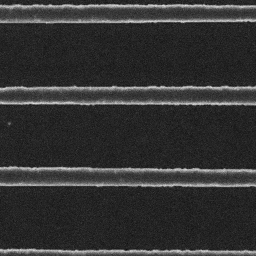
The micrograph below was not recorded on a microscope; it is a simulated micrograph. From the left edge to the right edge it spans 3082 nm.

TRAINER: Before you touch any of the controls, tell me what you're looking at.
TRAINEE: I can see lines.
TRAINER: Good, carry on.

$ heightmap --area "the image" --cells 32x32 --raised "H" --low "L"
LLLLLLLLLLLLLLLLLLLLLLLLLLLLLLLL
HHHHHHHHHHHHHHHHHHHHHHHHHHHHHHHH
HHHHHHHHHHHHHHHHHHHHHHHHHHHHHHHH
LLLLLLLLLLLLLLLLLLLLLLLLLLLLLLLL
LLLLLLLLLLLLLLLLLLLLLLLLLLLLLLLL
LLLLLLLLLLLLLLLLLLLLLLLLLLLLLLLL
LLLLLLLLLLLLLLLLLLLLLLLLLLLLLLLL
LLLLLLLLLLLLLLLLLLLLLLLLLLLLLLLL
LLLLLLLLLLLLLLLLLLLLLLLLLLLLLLLL
LLLLLLLLLLLLLLLLLLLLLLLLLLLLLLLL
LLLLLLLLLLLLLLLLLLLLLLLLLLLLLLLL
HHHHHHHHHHHHHHHHHHHHHHHHHHHHHHHH
HHHHHHHHHHHHHHHHHHHHHHHHHHHHHHHH
LLLLLLLLLLLLLLLLLLLLLLLLLLLLLLLL
LLLLLLLLLLLLLLLLLLLLLLLLLLLLLLLL
LLLLLLLLLLLLLLLLLLLLLLLLLLLLLLLL
LLLLLLLLLLLLLLLLLLLLLLLLLLLLLLLL
LLLLLLLLLLLLLLLLLLLLLLLLLLLLLLLL
LLLLLLLLLLLLLLLLLLLLLLLLLLLLLLLL
LLLLLLLLLLLLLLLLLLLLLLLLLLLLLLLL
LLLLLLLLLLLLLLLLLLLLLLLLLLLLLLLL
HHHHHHHHHHHHHHHHHHHHHHHHHHHHHHHH
HHHHHHHHHHHHHHHHHHHHHHHHHHHHHHHH
LLLLLLLLLLLLLLLLLLLLLLLLLLLLLLLL
LLLLLLLLLLLLLLLLLLLLLLLLLLLLLLLL
LLLLLLLLLLLLLLLLLLLLLLLLLLLLLLLL
LLLLLLLLLLLLLLLLLLLLLLLLLLLLLLLL
LLLLLLLLLLLLLLLLLLLLLLLLLLLLLLLL
LLLLLLLLLLLLLLLLLLLLLLLLLLLLLLLL
LLLLLLLLLLLLLLLLLLLLLLLLLLLLLLLL
LLLLLLLLLLLLLLLLLLLLLLLLLLLLLLLL
HHHHHHHHHHHHHHHHHHHHHHHHHHHHHLHL